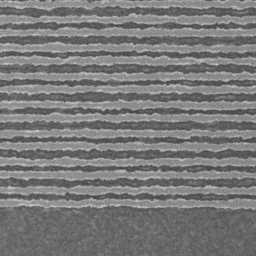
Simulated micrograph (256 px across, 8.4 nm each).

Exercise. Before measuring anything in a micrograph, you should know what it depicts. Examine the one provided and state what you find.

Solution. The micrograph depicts parallel lines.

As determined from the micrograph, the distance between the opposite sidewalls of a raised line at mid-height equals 56.7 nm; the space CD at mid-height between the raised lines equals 64.1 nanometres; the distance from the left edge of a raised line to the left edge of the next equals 119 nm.